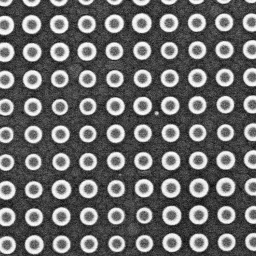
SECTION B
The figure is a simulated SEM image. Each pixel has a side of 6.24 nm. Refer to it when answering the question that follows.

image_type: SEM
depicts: an array of small figures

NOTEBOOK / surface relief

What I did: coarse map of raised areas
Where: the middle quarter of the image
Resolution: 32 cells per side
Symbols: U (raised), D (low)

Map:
DDDDDDDDDDDDDDDDDDDDDDDDDDDDDDDD
DDDDDDDDDDDDDDDDDDDDDDDDDDUDDDDD
UDDDUUUUDDDUUUDDDDUUUDDDDUUUDDDU
UDDDUUUUDDDUUUUDDDUUUUDDUUUUUDDU
UDDDUUUUDDDUUUUDDDUUUUDDUUUUDDDU
DDDDDUUDDDDDUUDDDDDUUDDDDDUDDDDD
DDDDDDDDDDDDDDDDDDDDDDDDDDDDDDDD
DDDDDDDDDDDDDDDDDDDDDDDDDDDDDDDD
DDDDDDDDDDDDUDDDDDDUUDDDDUUUDDDD
DDDDUUUUDDDUUUUDDDUUUUDDDUUUDDDU
UDDDUUUUDDDUUUUDDUUUUUDDUUUUUDDU
UDDDUUUUDDDUUUUDDDUUUUDDDUUUDDDD
DDDDDUUDDDDDUUDDDDDUUDDDDDUDDDDD
DDDDDDDDDDDDDDDDDDDDDDDDDDDDDDDD
DDDDDDDDDDDDDDDDDDDDDDDDDDDDDDDD
DDDDDDDDDDDDUUDDDDDUUDDDDUUUDDDD
UDDDUUUUDDDUUUUDDDUUUUDDDUUUUDDU
UDDDUUUUDDDUUUUDDDUUUUDDDUUUUDDU
UDDDUUUUDDDUUUUDDDUUUUDDDUUUDDDD
DDDDDDDDDDDDUUDDDDDDDDDDDDDDDDDD
DDDDDDDDDDDDDDDDDDDDDDDDDDDDDDDD
DDDDDDDDDDDDDDDDDDDDDDDDDDDDDDDD
DDDDDUUDDDDDUUDDDDUUUDDDDUUUDDDD
UDDDUUUUDDDUUUUDDDUUUUDDDUUUUDDU
UDDDUUUUDDDUUUUDDDUUUUDDUUUUUDDU
UDDDUUUUDDDUUUUDDDUUUUDDDUUUUDDD
DDDDDUUDDDDDDDDDDDDDDDDDDDDDDDDD
DDDDDDDDDDDDDDDDDDDDDDDDDDDDDDDD
DDDDDDDDDDDDDDDDDDDDDDDDDDDDDDDD
UDDDDUUDDDDDUUDDDDUUUUDDDUUUDDDD
UDDDUUUUDDDUUUUDDDUUUUDDUUUUUDDU
UUDDUUUUDDDUUUUDDDUUUUDDUUUUUDDU